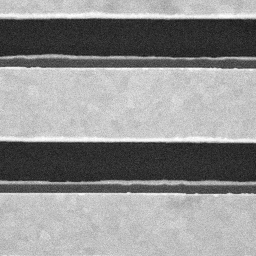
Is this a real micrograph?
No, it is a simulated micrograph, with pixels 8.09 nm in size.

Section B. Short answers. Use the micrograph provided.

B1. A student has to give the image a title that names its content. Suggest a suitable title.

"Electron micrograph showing lines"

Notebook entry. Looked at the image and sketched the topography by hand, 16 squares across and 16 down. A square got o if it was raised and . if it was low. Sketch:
oooooooooooooooo
................
................
................
oooooooooooooooo
oooooooooooooooo
oooooooooooooooo
oooooooooooooooo
oooooooooooooooo
................
................
................
oooooooooooooooo
oooooooooooooooo
oooooooooooooooo
oooooooooooooooo